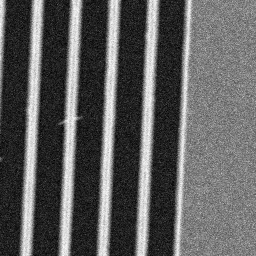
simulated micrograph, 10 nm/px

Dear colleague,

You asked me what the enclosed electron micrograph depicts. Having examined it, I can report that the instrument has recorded parallel lines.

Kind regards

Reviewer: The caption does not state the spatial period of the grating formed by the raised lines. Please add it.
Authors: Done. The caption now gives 38.3 pixels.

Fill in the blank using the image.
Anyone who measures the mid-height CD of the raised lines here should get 76.2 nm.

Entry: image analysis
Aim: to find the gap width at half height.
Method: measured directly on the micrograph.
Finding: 30.3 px